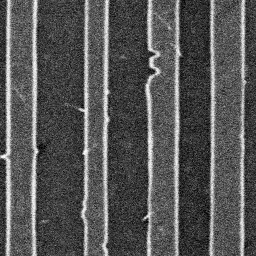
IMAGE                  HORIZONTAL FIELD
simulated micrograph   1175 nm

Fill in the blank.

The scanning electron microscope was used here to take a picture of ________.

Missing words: one or a few lines or trenches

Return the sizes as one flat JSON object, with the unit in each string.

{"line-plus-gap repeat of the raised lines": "315 nanometers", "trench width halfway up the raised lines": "194 nanometers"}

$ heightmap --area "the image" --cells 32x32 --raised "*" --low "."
.***.......**......***....****..
.***.......**......***....****..
.***.......**......***....****..
.***.......**......***....****..
.***.......**......***....****..
.***.......**......***....****..
.***.......**......***....****..
.***.......**......***....****..
.***.......**......***.....***..
.***.......**......***.....***..
.***.......**.....****.....****.
.***.......**.....****.....***..
.***.......**......***.....***..
.***.......**......***.....***..
.***.......**......***.....***..
.***.......**......***.....***..
.***.......**......***.....***..
.***.......**......***.....***..
.****......**......***.....***..
.****......**......***.....***..
.***.......**......***.....***..
.***.......**......***.....***..
.***.......**......***.....***..
.***.......**......***.....***..
.***.......**......***.....***..
.***......***......***....****..
.***......***.....****....****..
.***......***.....****....****..
.***.......**......***....****..
.***.......**......***....****..
.***.......**......***....****..
.***.......**......***....****..